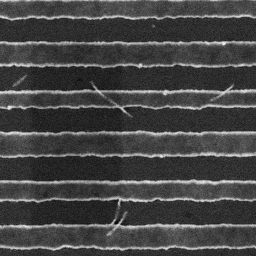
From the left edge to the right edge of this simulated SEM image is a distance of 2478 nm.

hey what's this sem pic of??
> lines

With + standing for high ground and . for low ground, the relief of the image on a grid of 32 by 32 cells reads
++++++++++++++++++++++++++++++++
++++++++++++++++++++++++++++++++
................................
................................
................................
++++++++++++++++++++++++++++++++
++++++++++++++++++++++++++++++++
++++++++++++++++++++++++++++++++
................................
................................
................................
++++++++++++++++++++++++++++++++
++++++++++++++++++++++++++++++++
+++++++..+...+.+...+..++++......
................................
................................
.............+...+..............
++++++++++++++++++++++++++++++++
++++++++++++++++++++++++++++++++
+++++++++.+.+++++++++++++..+++++
................................
................................
................................
++++++++++++++++++++++++++++++++
++++++++++++++++++++++++++++++++
................................
................................
................................
++++++++++++++++++++++++++++++++
++++++++++++++++++++++++++++++++
++++++++++++++++++++++++++++++++
................................